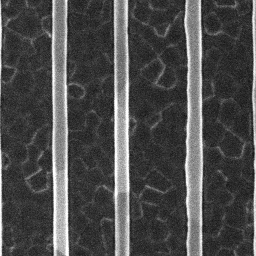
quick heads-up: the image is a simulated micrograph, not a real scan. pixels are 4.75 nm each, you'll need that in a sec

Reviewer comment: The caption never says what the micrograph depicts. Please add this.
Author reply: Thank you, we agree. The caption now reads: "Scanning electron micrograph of one or a few lines or trenches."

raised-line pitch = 0.316 microns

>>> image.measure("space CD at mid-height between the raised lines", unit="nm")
249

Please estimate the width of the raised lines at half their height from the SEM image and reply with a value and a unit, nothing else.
66 nanometres